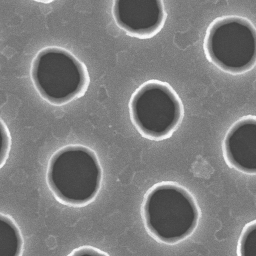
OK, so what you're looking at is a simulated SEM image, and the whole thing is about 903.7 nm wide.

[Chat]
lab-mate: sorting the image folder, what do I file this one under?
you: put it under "holes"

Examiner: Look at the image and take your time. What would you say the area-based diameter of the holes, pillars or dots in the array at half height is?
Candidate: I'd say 178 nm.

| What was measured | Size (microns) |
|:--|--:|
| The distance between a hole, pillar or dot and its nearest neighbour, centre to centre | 0.36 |